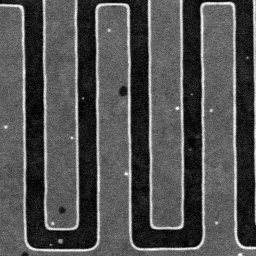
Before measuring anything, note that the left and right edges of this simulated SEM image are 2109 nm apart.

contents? groups of lines, slits or small figures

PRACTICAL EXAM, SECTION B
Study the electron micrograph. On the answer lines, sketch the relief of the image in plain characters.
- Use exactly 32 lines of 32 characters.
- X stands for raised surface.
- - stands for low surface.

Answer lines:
-----XXXXX---------XXXX---XXX---
XXX---XXXX--XXXX---XXXX--XXXX---
XXX---XXXX--XXXX---XXXX--XXXX---
XXX---XXXX--XXXX---XXXX--XXXX---
XXX---XXXX--XXXX---XXXX--XXXX---
XXX---XXXX--XXXX---XXXX--XXXX---
XXX---XXXX--XXXX---XXXX--XXXX---
XXX---XXXX--XXXX---XXXX--XXXX---
XXX---XXXX--XXXX---XXXX--XXXX---
XXX---XXXX--XXXX---XXXX--XXXX---
XXX---XXXX--XXXX---XXXX--XXXX---
XXX---XXXX--XXXX---XXXX--XXXX---
XXX---XXXX--XXXX---XXXX--XXXX---
XXX---XXXX--XXXX---XXXX--XXXX---
XXX---XXXX--XXXX---XXXX--XXXX---
XXX---XXXX--XXXX---XXXX--XXXX---
XXX---XXXX--XXXX---XXXX--XXXX---
XXX---XXXX--XXXX---XXXX--XXXX---
XXX---XXXX--XXXX---XXXX--XXXX---
XXX---XXXX--XXXX---XXXX--XXXX---
XXX---XXXX--XXXX---XXXX--XXXX---
XXX---XXXX--XXXX---XXXX--XXXX---
XXX---XXXX--XXXX---XXXX--XXXX---
XXX---XXXX--XXXX---XXXX--XXXX---
XXX---XXXX--XXXX---XXXX--XXXX---
XXX---XXXX--XXXX---XXXX--XXXX---
XXX---XXXX--XXXX---XXXX--XXXX---
XXX---XXXX--XXXX---XXXX--XXXX---
XXX---XXX---XXXX---------XXXX---
XXX---------XXXX---------XXXXX--
XXXX--------XXXXX--------XXXXX--
XXXXXXXXXXXXXXXXXXXXXXXXXXXXXXXX